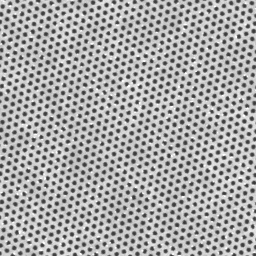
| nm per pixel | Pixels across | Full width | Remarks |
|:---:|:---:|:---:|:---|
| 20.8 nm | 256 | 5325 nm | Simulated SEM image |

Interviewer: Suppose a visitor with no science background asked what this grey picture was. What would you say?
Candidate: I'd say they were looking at a regular array of holes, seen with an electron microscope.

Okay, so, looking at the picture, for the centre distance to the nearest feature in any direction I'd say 158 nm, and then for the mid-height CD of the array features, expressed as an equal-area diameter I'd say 96.8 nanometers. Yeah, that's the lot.